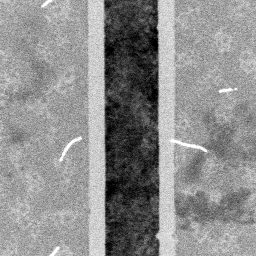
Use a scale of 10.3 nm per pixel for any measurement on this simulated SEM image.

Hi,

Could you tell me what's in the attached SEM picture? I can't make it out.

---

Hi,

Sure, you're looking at one or a few lines or trenches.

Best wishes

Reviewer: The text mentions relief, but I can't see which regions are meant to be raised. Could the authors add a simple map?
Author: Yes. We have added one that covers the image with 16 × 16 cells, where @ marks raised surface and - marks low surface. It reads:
@@@@@@----@@@@@@
@@@@@@----@@@@@@
@@@@@@----@@@@@@
@@@@@@----@@@@@@
@@@@@@----@@@@@@
@@@@@@----@@@@@@
@@@@@@----@@@@@@
@@@@@@----@@@@@@
@@@@@@----@@@@@@
@@@@@@----@@@@@@
@@@@@@----@@@@@@
@@@@@@----@@@@@@
@@@@@@----@@@@@@
@@@@@@----@@@@@@
@@@@@@----@@@@@@
@@@@@@----@@@@@@